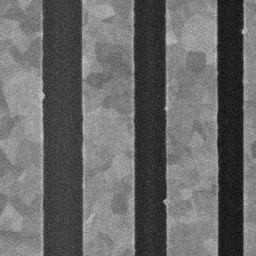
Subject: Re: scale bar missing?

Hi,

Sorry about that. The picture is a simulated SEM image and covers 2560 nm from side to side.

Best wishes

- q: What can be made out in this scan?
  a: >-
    lines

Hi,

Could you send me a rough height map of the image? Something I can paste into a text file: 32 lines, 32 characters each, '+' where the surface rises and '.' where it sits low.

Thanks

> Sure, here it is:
+++++.....+++++++....++++++....+
+++++.....+++++++....++++++....+
+++++.....+++++++....++++++....+
+++++.....+++++++....++++++...++
+++++.....+++++++....++++++...++
+++++.....+++++++....++++++....+
+++++.....+++++++....++++++....+
+++++.....+++++++....++++++....+
+++++.....+++++++....++++++....+
+++++.....+++++++....++++++...++
+++++.....+++++++....++++++...++
+++++.....+++++++....++++++....+
+++++.....+++++++....++++++....+
+++++.....+++++++....++++++....+
+++++.....+++++++....++++++....+
+++++.....+++++++....++++++....+
+++++.....+++++++....++++++....+
+++++.....+++++++....++++++....+
+++++.....+++++++....++++++....+
+++++.....+++++++....++++++....+
+++++.....+++++++....++++++....+
+++++.....+++++++....++++++....+
+++++.....+++++++....++++++....+
+++++.....+++++++....++++++....+
+++++.....+++++++....++++++....+
+++++.....+++++++....++++++....+
+++++.....+++++++....++++++....+
+++++.....+++++++....++++++....+
+++++.....+++++++....++++++....+
+++++.....+++++++....++++++....+
+++++.....+++++++....++++++....+
+++++.....+++++++....++++++....+